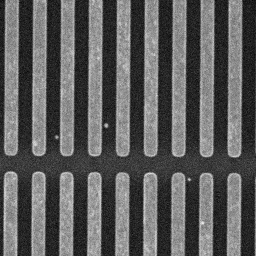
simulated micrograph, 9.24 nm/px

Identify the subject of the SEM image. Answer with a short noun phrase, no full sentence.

groups of lines, slits or small figures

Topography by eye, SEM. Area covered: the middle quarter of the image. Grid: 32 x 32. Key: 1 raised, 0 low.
11000011100001110000111000011100
11000011100001110000111000011100
11000011100001110000111000011100
11000011100001110000111000011100
11000011100001110000111000011100
11000011100001110000111000011100
11000011100001110000111000011100
11000011100001110000111000011100
11000011100001110000111000011100
11000011100001110000111000011100
11000011100001110000111000011100
11000011100001110000111000011100
11000011100001110000111000011100
11000011100001110000111000011100
11000011100001110000111000011100
11000011100001110000111000011100
11000011100001110000111000011100
11000011100001110000111000011100
11000011100001110000111000011100
11000011100001110000111000011100
11000011100001110000111000011100
11000011100001110000111000011100
11000001100001110000111000011100
00000000000000000000000000000000
00000000000000000000000000000000
00000000000000000000000000000000
00000000000000000000000000000000
11000001100000110000010000001000
11000011100001110000111000011100
11000011100001110000111000011100
11000011100001110000111000011100
11000011100001110000111000011100